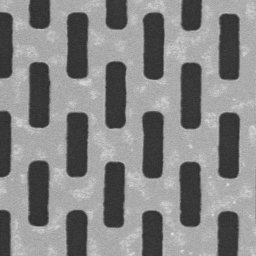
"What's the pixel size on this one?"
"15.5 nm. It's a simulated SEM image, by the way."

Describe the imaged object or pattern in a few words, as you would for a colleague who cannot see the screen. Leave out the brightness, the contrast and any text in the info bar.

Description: a regular array of holes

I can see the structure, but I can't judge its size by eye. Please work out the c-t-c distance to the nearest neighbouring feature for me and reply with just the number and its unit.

960 nanometres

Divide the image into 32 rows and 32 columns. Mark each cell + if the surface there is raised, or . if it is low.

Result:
++++..+++++++...+++++++..+++++++
.+++..+++.+++...+++++++..+++++++
..++..++...++...++..+++..++...++
..++..++...+++..++...++..++...++
..++++++...+++++++...++++++...++
..++++++...+++++++..+++++++...++
..++++++...+++++++..+++++++...++
..++++++...+++++++..+++++++...++
..++..++...++...++...++..++...++
.+++..+++..++...++..++...++...++
++++..+++++++...++++++...+++++++
+++...+++++++...++++++...+++++++
+++...+++++++...++++++...+++++++
+++...+++++++...++++++...+++++++
.++...++...++...++..++...+++..++
..++..++...++...++...++..++...++
..++++++...+++++++..+++++++...++
..++++++...+++++++..+++++++...++
..++++++...+++++++..+++++++...++
..++++++...+++++++..+++++++...++
..++..++...++..+++..+++..++...++
.++...++...++...++..++...++...++
+++...+++++++...++++++...+++++++
+++...+++++++...++++++...+++++++
+++...+++++++...++++++...+++++++
+++...+++++++...++++++...+++++++
.++...+++..++...++..++...+++.+++
.++...++...++...++..++...++...++
.+++++++...+++.+++..+++++++...++
.+++++++...+++++++..+++++++...++
.+++++++...+++++++..+++++++...++
.+++++++...+++++++..+++++++...++